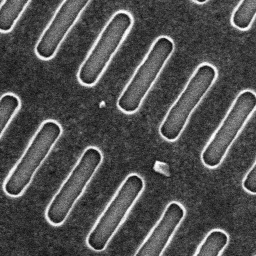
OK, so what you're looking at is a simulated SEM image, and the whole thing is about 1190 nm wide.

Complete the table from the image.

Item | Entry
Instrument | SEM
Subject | holes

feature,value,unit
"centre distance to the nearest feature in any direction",230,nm